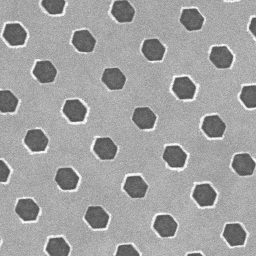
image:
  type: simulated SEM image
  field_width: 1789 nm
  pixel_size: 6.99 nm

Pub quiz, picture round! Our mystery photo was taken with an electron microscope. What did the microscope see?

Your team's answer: a regular array of holes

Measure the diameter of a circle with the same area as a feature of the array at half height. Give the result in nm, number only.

163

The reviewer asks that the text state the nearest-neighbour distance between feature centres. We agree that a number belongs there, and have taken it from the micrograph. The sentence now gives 340 nm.